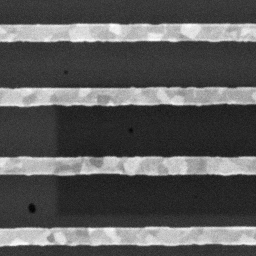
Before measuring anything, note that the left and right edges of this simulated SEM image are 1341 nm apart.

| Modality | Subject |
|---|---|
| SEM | lines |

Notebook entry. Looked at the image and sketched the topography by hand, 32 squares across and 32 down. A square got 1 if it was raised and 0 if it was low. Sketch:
00000000000000000000000000000000
00000000000000000000000000000000
00000000000000000000000000000000
11111111111111111111111111111111
11111111111111111111111111111111
00000000000000000000000000000000
00000000000000000000000000000000
00000000000000000000000000000000
00000000000000000000000000000000
00000000000000000000000000000000
00000000000000000000000000000000
11111111111111111111111111111111
11111111111111111111111111111111
00000000000000000000000000000000
00000000000000000000000000000000
00000000000000000000000000000000
00000000000000000000000000000000
00000000000000000000000000000000
00000000000000000000000000000000
00000000000000000000000000000000
11111111111111111111111111111111
11111111111111111111111111111111
00000000000000000000000000000000
00000000000000000000000000000000
00000000000000000000000000000000
00000000000000000000000000000000
00000000000000000000000000000000
00000000000000000000000000000000
00000000000000000011100011111111
11111111111111111111111111111111
11111111111111111111111111011111
00000000000000000000000000000000